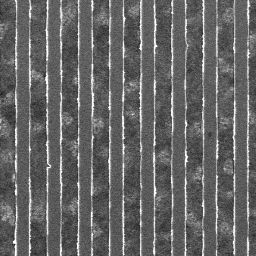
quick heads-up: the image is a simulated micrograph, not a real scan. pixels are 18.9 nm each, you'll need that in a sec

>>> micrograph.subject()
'parallel lines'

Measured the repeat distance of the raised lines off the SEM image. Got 0.589 µm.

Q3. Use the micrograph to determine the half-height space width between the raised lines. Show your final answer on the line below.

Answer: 321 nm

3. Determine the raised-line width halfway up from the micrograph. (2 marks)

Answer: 14.1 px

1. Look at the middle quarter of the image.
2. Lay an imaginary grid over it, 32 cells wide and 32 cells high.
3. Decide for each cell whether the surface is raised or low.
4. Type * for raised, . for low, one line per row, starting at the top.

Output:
....***....****....****....***..
....***.....***....****....***..
....***.....***....****....***..
....***....****....****....***..
....***....****....****....***..
....***....****....****....***..
....***....****....****....***..
....***....****....****....***..
...****....****....****....***..
....***....****....****....***..
....***....****....****....***..
....***....****....****....***..
....***....****....****....***..
....***....****....****....***..
....***....****....****....***..
....***....****....****....****.
....***....****....****....***..
....***....****....****....***..
....***....****....****....***..
....***....****....****....***..
..*.***....****....****....***..
....***....****....***.....***..
....***....****....****....****.
....***....****....****....****.
....***....****....****....****.
....***....****....****....***..
....***....****....****....***..
....***....****....****....***..
....***....****....****....***..
...****....****....****....***..
....***....****....****....***..
....***....****....****....***..